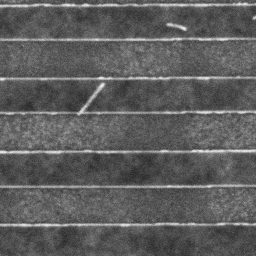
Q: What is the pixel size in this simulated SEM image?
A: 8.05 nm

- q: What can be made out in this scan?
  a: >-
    lines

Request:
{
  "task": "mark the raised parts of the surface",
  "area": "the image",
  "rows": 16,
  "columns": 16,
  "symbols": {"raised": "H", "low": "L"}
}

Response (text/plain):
HHHHHHHHHHHHHHHH
HHHHHHHHHHHHHHHH
LLLLLLLLLLLLLLLL
LLLLLLLLLLLLLLLL
LLLLLLLLLLLLLLLL
HHHHHHHHHHHHHHHH
HHHHHHHHHHHHHHHH
LLLLLLLLLLLLLLLL
LLLLLLLLLLLLLLLL
HHHHHHHHHHHHHHHH
HHHHHHHHHHHHHHHH
HHHHHHHHHHHHHHHH
LLLLLLLLLLLLLLLL
LLLLLLLLLLLLLLLL
HHHHHHHHHHHHHHHH
HHHHHHHHHHHHHHHH